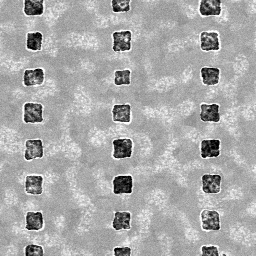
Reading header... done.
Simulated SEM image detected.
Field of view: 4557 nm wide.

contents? a regular array of holes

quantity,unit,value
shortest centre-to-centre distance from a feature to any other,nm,635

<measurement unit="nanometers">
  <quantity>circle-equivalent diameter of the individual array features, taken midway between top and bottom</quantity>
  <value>364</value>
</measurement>